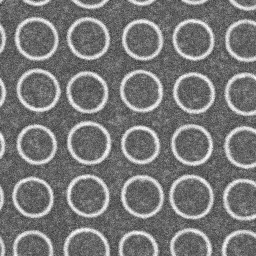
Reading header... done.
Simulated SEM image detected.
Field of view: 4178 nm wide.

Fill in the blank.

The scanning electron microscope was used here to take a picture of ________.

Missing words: a regular array of raised bodies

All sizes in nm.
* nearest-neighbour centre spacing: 835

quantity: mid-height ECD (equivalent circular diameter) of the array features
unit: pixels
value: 39.3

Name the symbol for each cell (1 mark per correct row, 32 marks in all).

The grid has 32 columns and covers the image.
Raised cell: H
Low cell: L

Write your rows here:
LLLLHLLLLLHHHLLLLLLLLLLLLLLLLHHH
LLLLLLLLLLLLLLLLLLLLLLLLLLLLLLLL
LLLLHLLLLLHHLLLLLLLLLLLLLLLLLLLL
LLHHHHHLLHHHHLLLHHHHLLHHHHLLLHHH
LLHHHHHLLHHHHLLLHHHHLLHHHHLLHHHH
LLHHHHHLLHHHHLLLHHHHLLHHHHHLHHHH
LLLHHHLLLHHHHLLLHHHHLLLHHHLLLHHH
LLLLLLLLLLLLLLLLLLLLLLLLLLLLLLLL
LLLLLLLLLLLLLLLLLLLLLLLLLLLLLLLL
LLLHHHLLLLHHLLLLHHHLLLLHHLLLLLHL
LLHHHHHLLHHHHLLHHHHHLLHHHHLLLHHH
LLHHHHHLLHHHHLLHHHHHLLHHHHHLHHHH
LLLHHHHLLHHHHLLLHHHHLLHHHHHLLHHH
LLLLHHLLLLHHLLLLLHHLLLLHHHLLLHHH
LLLLLLLLLLLLLLLLLLLLLLLLLLLLLLLL
LLLLLLLLLLHLLLLLLLLLLLLLLLLLLLLL
LLLHHHLLLHHHHLLLHHHLLLHHHHLLLHHH
LLHHHHHLLHHHHHLHHHHHLLHHHHLLHHHH
LLHHHHHLLHHHHHLHHHHHLLHHHHLLHHHH
LLLHHHLLLHHHHLLLHHHLLLHHHHLLLHHH
LLLLLLLLLLLLLLLLLLLLLLLLLLLLLLHH
LLLLLLLLLLLLLLLLLLLLLLLLLLLLLLLL
LLLHHLLLLLHHLLLLHHHLLLHHHLLLLLLL
LLHHHHLLLHHHHLLLHHHHLLHHHHLLLHHH
LLHHHHLLLHHHHLLHHHHHLHHHHHLLHHHH
LLHHHHLLLHHHHLLLHHHHLLHHHHLLHHHH
LLLHHHLLLLHHHLLLHHHLLLHHHHLLLHHH
LLLLLLLLLLLLLLLLLLLLLLLLLLLLLLLL
LLLLLLLLLLLLLLLLLLLLLLLLLLLLLLLL
LLLHHLLLLHHHHLLLHHHLLLHHHLLLLHHH
LLHHHHLLHHHHHLLHHHHLLLHHHHLLHHHH
LLHHHHLLHHHHHLLHHHHLLLHHHHLLHHHH